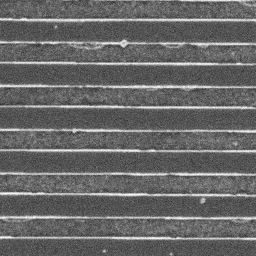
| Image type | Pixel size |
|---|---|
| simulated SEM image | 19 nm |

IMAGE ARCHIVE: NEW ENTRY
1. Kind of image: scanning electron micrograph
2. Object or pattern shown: lines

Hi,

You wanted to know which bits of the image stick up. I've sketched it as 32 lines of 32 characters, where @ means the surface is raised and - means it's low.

--------------------------------
--------------------------------
@@@@@@@@-@@@@@@@@@@@@@@@@@@@@---
@@@@@@@@@@@@@@@@@@@@@@@@@@@@@@@@
@@@@@@@@@@@@@@@@@@@@@@@@@@@@@@@@
---------------@--------@@@@@@@@
--------------------------------
--------------------------------
@@@@@@@@@@@@@@@@@@@@@@@@@@@@@@@@
@@@@@@@@@@@@@@@@@@@@@@@@@@@@@@@@
@@@@@@@@@@@@@@@@@@@@@@@@@@@@@@@@
--------------------------------
--------------------------------
@@@@@@@@@@@@@@@@@@@@@@@@@@-@----
@@@@@@@@@@@@@@@@@@@@@@@@@@@@@@@@
@@@@@@@@@@@@@@@@@@@@@@@@@@@@@@@@
--------------------------------
--------------------------------
--------------------------------
@@@@@@@@@@@@@@@@@@@@@@@@@@@@@@@@
@@@@@@@@@@@@@@@@@@@@@@@@@@@@@@@@
@@@@@@@@@@@@@@@@@@@@@@@@@@@@@@@@
--------------------------------
--------------------------------
@@@@@@@@@@@@@@@@@@@@@@@@@@@@@@@@
@@@@@@@@@@@@@@@@@@@@@@@@@@@@@@@@
@@@@@@@@@@@@@@@@@@@@@@@@@@@@@@@@
--------------------------------
--------------------------------
--------------------------------
@@@@@@@@@@@@@@@@@@@@@@@@@@@@@@@@
@@@@@@@@@@@@@@@@@@@@@@@@@@@@@@@@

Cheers